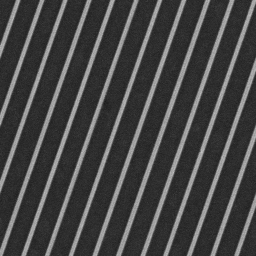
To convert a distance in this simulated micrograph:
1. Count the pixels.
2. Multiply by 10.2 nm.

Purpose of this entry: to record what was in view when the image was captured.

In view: parallel lines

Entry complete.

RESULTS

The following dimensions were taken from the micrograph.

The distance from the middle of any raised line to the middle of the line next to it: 227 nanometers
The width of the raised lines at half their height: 37.2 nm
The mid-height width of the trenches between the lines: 196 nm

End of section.